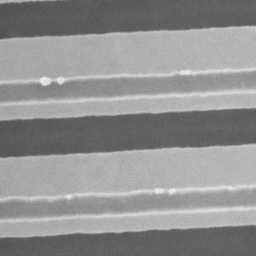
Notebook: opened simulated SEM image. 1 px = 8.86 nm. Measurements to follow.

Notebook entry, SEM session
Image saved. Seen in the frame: lines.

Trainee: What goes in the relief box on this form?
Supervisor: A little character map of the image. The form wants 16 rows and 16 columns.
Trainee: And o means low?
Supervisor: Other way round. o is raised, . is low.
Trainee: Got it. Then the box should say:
................
................
oooooooooooooooo
oooooooooooooooo
oooooooooooooooo
oooooooooooooooo
oooooooooooooooo
................
................
.......ooooooooo
oooooooooooooooo
oooooooooooooooo
oooooooooooooooo
oooooooooooooooo
ooooooo.........
................